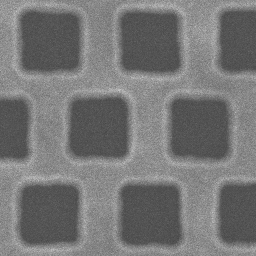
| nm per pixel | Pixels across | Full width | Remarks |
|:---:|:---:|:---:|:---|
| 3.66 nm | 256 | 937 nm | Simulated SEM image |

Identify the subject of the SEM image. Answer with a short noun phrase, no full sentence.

holes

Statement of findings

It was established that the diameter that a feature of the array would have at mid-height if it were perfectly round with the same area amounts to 260 nm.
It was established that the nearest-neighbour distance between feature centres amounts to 364 nm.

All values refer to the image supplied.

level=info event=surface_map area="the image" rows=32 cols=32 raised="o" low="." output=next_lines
oooooooooooooooooooooooooooooooo
ooo......oooooo.......oooooo....
oo........ooooo........oooo.....
oo........ooooo........oooo.....
oo........ooooo........oooo.....
oo........ooooo........oooo.....
oo........ooooo........oooo.....
oo........ooooo........oooo.....
ooo.......ooooo........oooo.....
oooooooooooooooooooooooooooooooo
oooooooooooooooooooooooooooooooo
oooooooooooooooooooooooooooooooo
...oooooo.......oooooo......oooo
....oooo........ooooo........ooo
....oooo........ooooo........ooo
....oooo........ooooo........ooo
....oooo........ooooo........ooo
....oooo........ooooo........ooo
....oooo........ooooo........ooo
....ooooo.......ooooo........ooo
oooooooooooooooooooooooooooooooo
oooooooooooooooooooooooooooooooo
oooooooooooooooooooooooooooooooo
oo........ooooo.......ooooo.....
oo........ooooo........oooo.....
oo........ooooo........oooo.....
oo........ooooo........oooo.....
oo........ooooo........oooo.....
oo........ooooo........oooo.....
oo........ooooo........oooo.....
ooo.......ooooo........ooooo....
oooooooooooooooooooooooooooooooo